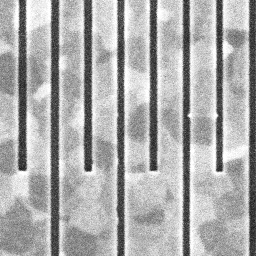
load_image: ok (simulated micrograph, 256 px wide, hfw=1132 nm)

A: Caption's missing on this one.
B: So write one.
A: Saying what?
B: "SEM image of parallel lines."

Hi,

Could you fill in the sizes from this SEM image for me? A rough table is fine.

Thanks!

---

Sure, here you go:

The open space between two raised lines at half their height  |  38.7 nm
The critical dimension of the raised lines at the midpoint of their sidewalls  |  108 nm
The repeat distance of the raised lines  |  146 nm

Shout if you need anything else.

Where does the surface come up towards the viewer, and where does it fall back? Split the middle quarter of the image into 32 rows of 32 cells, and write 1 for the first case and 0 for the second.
11111001111110011111100011111000
11111001111110011111100011111000
11111001111110011111100011111000
11111001111110011111100011111000
11111001111110011111100011111000
11111001111110011111100011111000
11111001111110011111100011111000
11111001111110011111100011111000
11111001111110011111100011111000
11111001111110011111100011111000
11111001111110011111100011111000
11111001111110011111100011111000
11111001111110011111100011111000
11111001111110011111100011111000
11111001111110011111100011111000
11111001111110011111100011111000
11111001111110011111100011111000
11111001111110011111100011111000
11111001111110001111100011111000
11111001111110011111100011111000
11111001111110011111100011111000
11111001111110001111100011111000
11111001111110001111100011111000
11111001111110001111100011111000
11111001111110001111100011111000
11111001111110001111100011111000
11111001111110001111100011111000
11111111111110001111111111111000
11111111111110001111111111111000
11111111111110001111111111111000
11111111111110001111111111111000
11111111111110001111111111111000